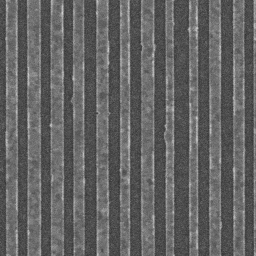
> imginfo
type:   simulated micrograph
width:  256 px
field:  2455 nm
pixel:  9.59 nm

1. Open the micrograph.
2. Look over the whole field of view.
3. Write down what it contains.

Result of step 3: parallel lines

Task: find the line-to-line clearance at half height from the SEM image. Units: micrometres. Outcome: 0.116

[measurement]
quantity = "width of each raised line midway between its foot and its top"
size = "101 nm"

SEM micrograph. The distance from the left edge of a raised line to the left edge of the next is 218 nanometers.